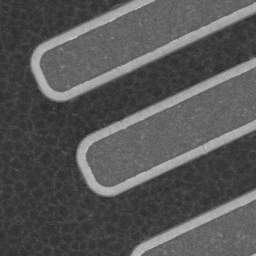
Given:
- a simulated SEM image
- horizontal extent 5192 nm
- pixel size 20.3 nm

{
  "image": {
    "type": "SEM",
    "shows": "one or a few lines or trenches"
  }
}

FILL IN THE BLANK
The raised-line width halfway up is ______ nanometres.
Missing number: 1120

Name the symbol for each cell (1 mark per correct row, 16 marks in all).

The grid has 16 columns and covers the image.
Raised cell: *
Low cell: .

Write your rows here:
........********
......********..
....********....
..*******.......
..*****........*
...**.......****
..........******
........********
......********..
.....*******....
.....*****......
......**........
...............*
.............***
...........*****
.........*******